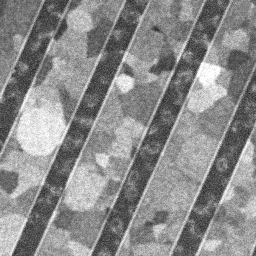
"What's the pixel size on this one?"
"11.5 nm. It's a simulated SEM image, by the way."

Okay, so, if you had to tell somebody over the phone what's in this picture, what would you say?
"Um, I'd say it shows one or a few lines or trenches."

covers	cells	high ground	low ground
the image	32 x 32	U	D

UUUUUDDDDUUUUUUDDDDUUUUUUDDDDUUU
UUUUUDDDUUUUUUUDDDUUUUUUUDDDUUUU
UUUUDDDDUUUUUUUDDDUUUUUUUDDDUUUU
UUUUDDDUUUUUUUDDDUUUUUUUDDDUUUUU
UUUDDDDUUUUUUUDDDUUUUUUUDDDUUUUU
UUUDDDUUUUUUUDDDUUUUUUUDDDUUUUUU
UUUDDDUUUUUUUDDDUUUUUUUDDDUUUUUU
UUDDDUUUUUUUDDDUUUUUUUDDDDUUUUUU
UUDDDUUUUUUUDDDUUUUUUUDDDUUUUUUU
UDDDUUUUUUUDDDDUUUUUUDDDDUUUUUUD
UDDDUUUUUUUDDDUUUUUUUDDDUUUUUUUD
DDDDUUUUUUDDDDUUUUUUDDDDUUUUUUDD
DDDUUUUUUUDDDUUUUUUUDDDUUUUUUUDD
DDDUUUUUUUDDDUUUUUUUDDDUUUUUUUDD
DDUUUUUUUDDDUUUUUUUDDDUUUUUUUDDD
DDUUUUUUUDDDUUUUUUUDDDUUUUUUUDDD
DUUUUUUUDDDUUUUUUUDDDDUUUUUUDDDD
DUUUUUUUDDDUUUUUUUDDDUUUUUUUDDDU
DUUUUUUDDDUUUUUUUDDDDUUUUUUDDDDU
UUUUUUUDDDUUUUUUUDDDUUUUUUUDDDUU
UUUUUUDDDUUUUUUUDDDDUUUUUUDDDDUU
UUUUUUDDDUUUUUUUDDDUUUUUUUDDDUUU
UUUUUDDDDUUUUUUDDDDUUUUUUDDDDUUU
UUUUUDDDUUUUUUUDDDUUUUUUUDDDUUUU
UUUUUDDDUUUUUUUDDDUUUUUUUDDDUUUU
UUUUDDDUUUUUUUDDDUUUUUUUDDDUUUUU
UUUUDDDUUUUUUUDDDUUUUUUUDDDUUUUU
UUUDDDUUUUUUUDDDDUUUUUUDDDDUUUUU
UUUDDDUUUUUUUDDDUUUUUUUDDDUUUUUU
UUDDDUUUUUUUDDDDUUUUUUDDDDUUUUUU
UUDDDUUUUUUUDDDUUUUUUUDDDUUUUUUU
UDDDDUUUUUUDDDDUUUUUUDDDDUUUUUUD